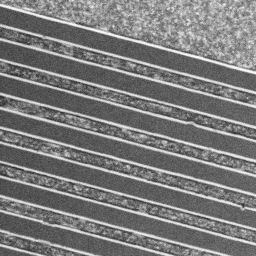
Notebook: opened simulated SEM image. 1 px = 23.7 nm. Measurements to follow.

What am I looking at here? parallel lines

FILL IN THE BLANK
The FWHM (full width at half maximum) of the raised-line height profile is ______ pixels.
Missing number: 18.9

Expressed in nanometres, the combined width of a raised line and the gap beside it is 785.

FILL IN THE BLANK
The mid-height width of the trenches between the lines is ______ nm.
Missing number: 335